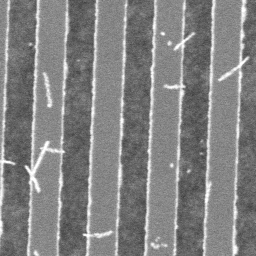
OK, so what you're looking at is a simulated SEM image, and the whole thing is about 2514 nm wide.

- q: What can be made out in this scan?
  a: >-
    lines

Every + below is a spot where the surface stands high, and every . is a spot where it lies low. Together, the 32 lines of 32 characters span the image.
+....+++....++++...++++....+++..
+....+++....++++...++++....+++..
+....+++....++++...++++....+++..
+....+++....++++...++++....+++..
+....+++....++++...++++....+++..
+...++++....++++...++++....+++..
+...++++....++++...++++...++++..
+...++++....++++...++++...++++..
+...++++....++++...++++...++++..
+...++++....+++....++++...++++..
+...++++....+++....++++...++++..
+...++++....+++....++++...++++..
+...++++....+++....++++...++++..
+...++++...++++....++++...++++..
+...++++...++++....++++...++++..
+...++++...++++....+++....++++..
+...++++...++++....+++....++++..
....++++...++++....+++....++++..
....++++...++++....+++....++++..
....++++...++++....+++....++++..
....++++...++++....+++....++++..
....++++...++++....+++....++++..
....++++...++++...++++....++++..
....++++...++++...++++....++++..
....+++....++++...++++....+++...
....+++....++++...++++....+++...
....+++....++++...++++....+++...
....+++....++++...++++....+++...
....+++....++++...++++....+++...
....+++....++++...++++....+++...
...++++....++++...++++...++++...
...++++....++++...++++...++++...